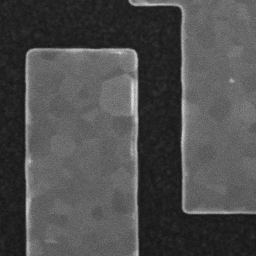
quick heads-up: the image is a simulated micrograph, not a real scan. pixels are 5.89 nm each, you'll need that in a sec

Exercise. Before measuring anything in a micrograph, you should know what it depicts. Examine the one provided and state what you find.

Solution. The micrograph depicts wiring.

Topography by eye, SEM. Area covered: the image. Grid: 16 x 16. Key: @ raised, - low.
-----------@@@@@
-----------@@@@@
-----------@@@@@
--@@@@@@---@@@@@
--@@@@@@@--@@@@@
--@@@@@@@--@@@@@
--@@@@@@@--@@@@@
--@@@@@@@--@@@@@
--@@@@@@@--@@@@@
--@@@@@@@--@@@@@
--@@@@@@@--@@@@@
--@@@@@@@--@@@@@
--@@@@@@@--@@@@@
--@@@@@@@-------
--@@@@@@@-------
--@@@@@@@-------